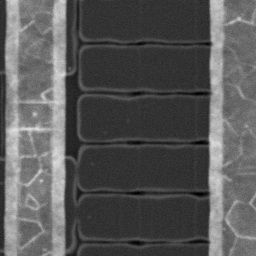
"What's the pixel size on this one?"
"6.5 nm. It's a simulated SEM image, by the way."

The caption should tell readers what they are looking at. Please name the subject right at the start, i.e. wiring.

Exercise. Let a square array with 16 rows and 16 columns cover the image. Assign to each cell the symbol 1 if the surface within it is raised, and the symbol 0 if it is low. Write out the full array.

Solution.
0111000000000111
0111000000000111
0111000000000011
0111000000000111
0111000000000111
0111000000000111
0111000000000111
0110000000000111
0111000000000111
0111000000000111
0111000000000111
0111000000000111
0111000000000111
0111000000000111
0111000000000111
0111000000000111